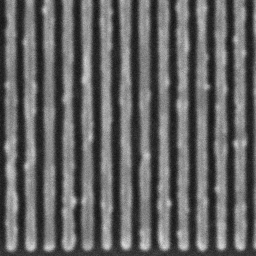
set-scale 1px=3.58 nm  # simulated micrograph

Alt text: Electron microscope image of parallel lines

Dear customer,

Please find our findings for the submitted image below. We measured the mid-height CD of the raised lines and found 33.6 nm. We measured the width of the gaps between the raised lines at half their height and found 36.7 nm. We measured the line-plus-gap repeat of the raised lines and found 68.4 nm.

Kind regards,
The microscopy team